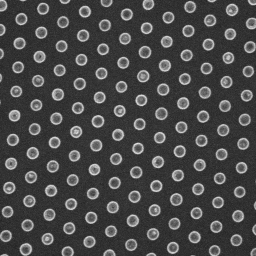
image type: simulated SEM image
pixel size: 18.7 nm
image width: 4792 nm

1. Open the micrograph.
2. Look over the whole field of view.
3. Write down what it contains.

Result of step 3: a regular array of raised bodies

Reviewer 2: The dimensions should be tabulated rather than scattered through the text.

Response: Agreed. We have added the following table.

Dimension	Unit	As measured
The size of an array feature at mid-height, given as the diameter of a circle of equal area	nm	204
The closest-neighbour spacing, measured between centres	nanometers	449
